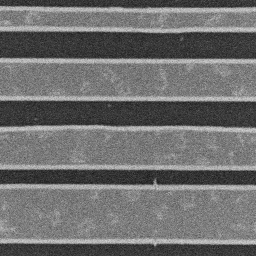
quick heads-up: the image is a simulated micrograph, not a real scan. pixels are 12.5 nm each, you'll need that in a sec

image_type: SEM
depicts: one or a few lines or trenches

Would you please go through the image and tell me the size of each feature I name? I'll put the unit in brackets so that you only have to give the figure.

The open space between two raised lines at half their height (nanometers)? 374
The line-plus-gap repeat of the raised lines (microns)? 0.81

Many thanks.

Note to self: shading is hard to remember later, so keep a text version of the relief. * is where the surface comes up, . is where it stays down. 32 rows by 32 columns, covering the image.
................................
********************************
********************************
********************************
................................
................................
................................
................................
********************************
********************************
********************************
********************************
................................
................................
................................
................................
********************************
********************************
********************************
********************************
********************************
................................
................................
***************************.....
********************************
********************************
********************************
********************************
********************************
********************************
................................
................................